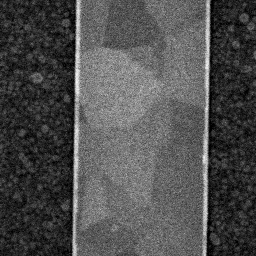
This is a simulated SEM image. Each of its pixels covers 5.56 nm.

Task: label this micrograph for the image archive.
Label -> one or a few lines or trenches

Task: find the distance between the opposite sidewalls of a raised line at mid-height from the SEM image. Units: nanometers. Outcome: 732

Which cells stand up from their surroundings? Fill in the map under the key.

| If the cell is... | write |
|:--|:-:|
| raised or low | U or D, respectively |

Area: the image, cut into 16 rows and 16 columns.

DDDDDUUUUUUUUDDD
DDDDDUUUUUUUUDDD
DDDDDUUUUUUUUDDD
DDDDDUUUUUUUUDDD
DDDDDUUUUUUUUDDD
DDDDDUUUUUUUUDDD
DDDDDUUUUUUUUDDD
DDDDDUUUUUUUUDDD
DDDDDUUUUUUUUDDD
DDDDDUUUUUUUUDDD
DDDDDUUUUUUUUDDD
DDDDDUUUUUUUUDDD
DDDDDUUUUUUUUDDD
DDDDDUUUUUUUUDDD
DDDDDUUUUUUUUDDD
DDDDDUUUUUUUUDDD